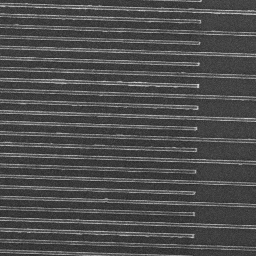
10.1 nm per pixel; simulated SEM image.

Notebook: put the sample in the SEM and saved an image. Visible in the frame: parallel lines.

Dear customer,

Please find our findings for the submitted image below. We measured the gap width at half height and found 0.0755 um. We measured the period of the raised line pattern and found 108 nm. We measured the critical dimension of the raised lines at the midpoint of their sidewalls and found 3.38 pixels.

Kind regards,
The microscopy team